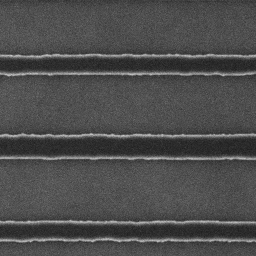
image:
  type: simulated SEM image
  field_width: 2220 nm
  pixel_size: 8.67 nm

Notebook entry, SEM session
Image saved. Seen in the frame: lines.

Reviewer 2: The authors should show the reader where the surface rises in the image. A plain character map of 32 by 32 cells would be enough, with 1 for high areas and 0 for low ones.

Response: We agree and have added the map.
00000000000000000000000000000000
00000000000000000000000000000000
00000000000000000000000000000000
00000000000000000000000000000000
00000000000000000000000000000000
00000000000000000000000000000000
00000000000000000000000000000000
11111111111111111111111111111111
11111111111111111111111111111111
00000000000000000000000000000000
00000000000000000000000000000000
00000000000000000000000000000000
00000000000000000000000000000000
00000000000000000000000000000000
00000000000000000000000000000000
00000000000000000000000000000000
00000000000000000000000000000000
11111111111111111111111111111111
11111111111111111111111111111111
11111111111111111111111111111111
00000000000000000000000000000000
00000000000000000000000000000000
00000000000000000000000000000000
00000000000000000000000000000000
00000000000000000000000000000000
00000000000000000000000000000000
00000000000000000000000000000000
00000000000000000000000000000000
11111111111111111111111111111111
11111111111111111111111111111111
00000000000000000000000000000000
00000000000000000000000000000000